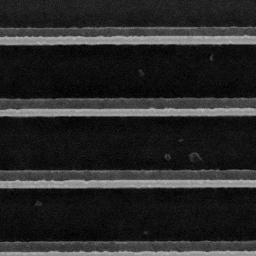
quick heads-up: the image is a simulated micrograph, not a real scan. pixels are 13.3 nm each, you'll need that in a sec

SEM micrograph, lines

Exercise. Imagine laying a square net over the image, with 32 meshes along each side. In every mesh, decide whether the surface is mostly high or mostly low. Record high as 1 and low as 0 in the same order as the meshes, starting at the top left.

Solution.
00000000000000000000000000000000
00000000000000000000000000000000
00000000000000000000000000000000
00000000001001111111111111111111
11111111111111111111111111111111
11111111110110101000000000000000
00000000000000000000000000000000
00000000000000000000000000000000
00000000000000000000000000000000
00000000000000000000000000000000
00000000000000000000000000000000
00000000000000000000000000000000
11111111111111111111111111111111
11111111111111111111111111111111
00010000000000000000000000000000
00000000000000000000000000000000
00000000000000000000000000000000
00000000000000000000000000000000
00000000000000000000000000000000
00000000000000000000000000000000
00000000000000000000000000000000
11111111111111111111111111111111
11111111111111111111111111111111
00000000000000000000000000000000
00000000000000000000000000000000
00000000000000000000000000000000
00000000000000000000000000000000
00000000000000000000000000000000
00000000000000000000000000000000
00000000000000000000000000000000
11111111111111111111111111111111
11111111111111111111111111111111